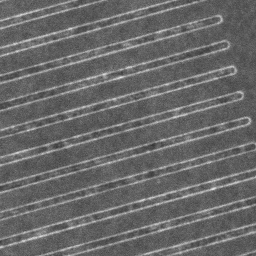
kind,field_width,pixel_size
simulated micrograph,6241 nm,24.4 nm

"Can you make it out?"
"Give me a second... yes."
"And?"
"parallel lines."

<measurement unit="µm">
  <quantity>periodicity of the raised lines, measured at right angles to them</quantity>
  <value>0.642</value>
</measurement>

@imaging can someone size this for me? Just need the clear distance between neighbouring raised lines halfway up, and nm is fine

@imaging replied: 464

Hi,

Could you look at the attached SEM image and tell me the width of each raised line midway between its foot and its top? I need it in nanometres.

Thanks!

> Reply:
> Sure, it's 185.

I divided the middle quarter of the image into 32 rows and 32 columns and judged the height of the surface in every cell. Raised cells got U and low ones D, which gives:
DDDDDDDDDDDDDDDDDDUUUUUUUDDDDDDD
DDDDDDDDDDDDDDUUUUUUUDDDDDDDDDDD
DDDDDDDDDDDUUUUUUUDDDDDDDDDDDDDD
DDDDDDDUUUUUUUDDDDDDDDDDDDDDDDDU
DDDUUUUUUUUDDDDDDDDDDDDDDDDDUUUU
UUUUUUUDDDDDDDDDDDDDDDDDUUUUUUUD
UUUDDDDDDDDDDDDDDDDDUUUUUUUDDDDD
DDDDDDDDDDDDDDDDDUUUUUUUDDDDDDDD
DDDDDDDDDDDDDUUUUUUUDDDDDDDDDDDD
DDDDDDDDDDUUUUUUUDDDDDDDDDDDDDDD
DDDDDDUUUUUUUDDDDDDDDDDDDDDDDDDU
DDUUUUUUUDDDDDDDDDDDDDDDDDDUUUUU
UUUUUUDDDDDDDDDDDDDDDDDDUUUUUUUD
UUDDDDDDDDDDDDDDDDDDUUUUUUUDDDDD
DDDDDDDDDDDDDDDDUUUUUUUDDDDDDDDD
DDDDDDDDDDDDDUUUUUUUDDDDDDDDDDDD
DDDDDDDDDUUUUUUUDDDDDDDDDDDDDDDD
DDDDDDUUUUUUUDDDDDDDDDDDDDDDDDDU
DDUUUUUUUDDDDDDDDDDDDDDDDDDUUUUU
UUUUUDDDDDDDDDDDDDDDDDDUUUUUUUDD
UUDDDDDDDDDDDDDDDDDDUUUUUUUDDDDD
DDDDDDDDDDDDDDDDUUUUUUUDDDDDDDDD
DDDDDDDDDDDDDUUUUUUUDDDDDDDDDDDD
DDDDDDDDDUUUUUUUDDDDDDDDDDDDDDDD
DDDDDUUUUUUUDDDDDDDDDDDDDDDDDUUU
DDUUUUUUUDDDDDDDDDDDDDDDDDUUUUUU
UUUUUDDDDDDDDDDDDDDDDDUUUUUUUDDD
UDDDDDDDDDDDDDDDDDDUUUUUUUDDDDDD
DDDDDDDDDDDDDDDUUUUUUUDDDDDDDDDD
DDDDDDDDDDDUUUUUUUDDDDDDDDDDDDDD
DDDDDDDDUUUUUUUDDDDDDDDDDDDDDDDD
DDDDUUUUUUUDDDDDDDDDDDDDDDDDDUUU